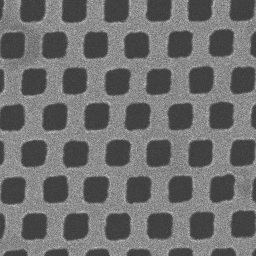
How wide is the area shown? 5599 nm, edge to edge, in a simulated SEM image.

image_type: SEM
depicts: a regular array of holes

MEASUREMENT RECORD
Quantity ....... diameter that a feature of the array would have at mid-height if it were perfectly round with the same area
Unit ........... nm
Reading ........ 625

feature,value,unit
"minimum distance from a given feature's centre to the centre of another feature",0.895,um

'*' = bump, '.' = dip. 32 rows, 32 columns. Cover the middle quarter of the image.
********************************
......******....******.....****.
......****.......****......****.
......****.......***.......****.
......****.......***.......****.
......****.......***.......****.
......****......****.......****.
....*******....******....*******
********************************
********************************
.*****.....*****.....******.....
.****.......***.......****......
.****......****.......****......
.****......****.......****......
.****......****.......****......
.****......****......*****......
******...*******..*.******.....*
********************************
********************************
*.....*****.....*****.....******
......*****......****......****.
......****.......***.......****.
......****.......***.......****.
......****.......***.......****.
......****......*****......****.
.....******....******....******.
********************************
********************************
.*****.....*****.....******.....
.****.......****......****......
.****......*****......****......
.****......*****......****......